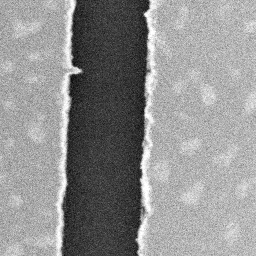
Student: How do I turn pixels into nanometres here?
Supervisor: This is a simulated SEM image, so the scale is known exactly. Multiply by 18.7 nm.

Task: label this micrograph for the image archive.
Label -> one or a few lines or trenches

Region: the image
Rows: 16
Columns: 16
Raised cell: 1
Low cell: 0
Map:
1111000001111111
1111000001111111
1111000001111111
1111000001111111
1111100001111111
1111000001111111
1111000001111111
1111000001111111
1111000001111111
1111000001111111
1111000001111111
1111000001111111
1111000001111111
1111000001111111
1111000001111111
1111000001111111